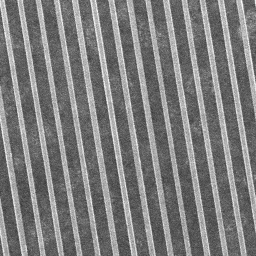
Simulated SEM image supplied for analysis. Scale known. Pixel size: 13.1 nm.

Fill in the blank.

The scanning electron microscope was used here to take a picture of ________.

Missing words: parallel lines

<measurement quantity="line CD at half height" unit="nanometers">63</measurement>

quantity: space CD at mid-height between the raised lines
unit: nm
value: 178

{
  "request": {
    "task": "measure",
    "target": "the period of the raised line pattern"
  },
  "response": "236 nm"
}